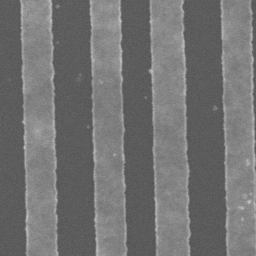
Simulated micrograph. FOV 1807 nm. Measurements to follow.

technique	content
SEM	lines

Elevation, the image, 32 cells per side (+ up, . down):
...+++.....++++....++++.....+++.
...+++.....++++....++++.....+++.
...+++.....++++....++++.....++++
...+++.....++++....++++.....++++
...++++....++++....++++.....++++
...++++....++++....++++.....+++.
...++++....++++....++++.....++++
...++++....++++....++++.....++++
...++++.....+++....++++.....++++
...++++.....+++....++++.....++++
...++++.....+++....++++.....++++
...++++.....+++....++++.....++++
...++++.....+++....++++.....++++
...++++.....+++....++++.....++++
...++++.....+++....++++.....++++
...++++.....+++....++++.....++++
...++++.....++++...++++.....++++
...++++.....+++....++++.....++++
...++++.....+++....++++.....++++
...++++.....++++...++++.....++++
...++++.....++++...++++.....++++
...++++.....++++...+++++....++++
...++++.....++++...++++.....++++
...++++.....++++...++++.....++++
...++++.....++++...+++++....++++
...++++.....++++...+++++....++++
...++++.....++++...+++++....++++
...++++.....++++...+++++....++++
...++++.....++++...+++++....++++
...++++.....++++....++++....++++
...++++.....++++....++++....++++
...++++.....++++....++++....++++